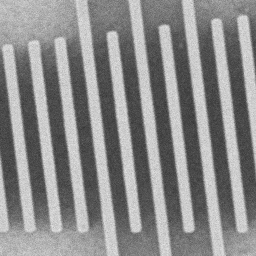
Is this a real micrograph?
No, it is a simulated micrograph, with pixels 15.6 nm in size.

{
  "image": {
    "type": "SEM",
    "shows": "groups of lines, slits or small figures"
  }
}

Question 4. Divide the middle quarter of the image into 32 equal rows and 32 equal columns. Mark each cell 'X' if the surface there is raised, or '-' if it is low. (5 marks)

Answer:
X----XXX----XX----XXX----XX-----
X----XXX----XX-----XX----XXX----
X----XXX----XXX----XX----XXX----
X----XXX----XXX----XX----XXX----
XX----XX----XXX----XX----XXX----
XX----XX----XXX----XX-----XX----
XX----XX----XXX----XXX----XX----
XX----XX-----XX----XXX----XX----
XX----XXX----XX----XXX----XX----
XX----XXX----XX-----XX----XXX---
XX----XXX----XX-----XX----XXX---
XX----XXX----XXX----XX----XXX---
XXX----XX----XXX----XX-----XX---
XXX----XX----XXX----XX-----XX---
XXX----XX-----XX----XXX----XX---
XXX----XX-----XX----XXX----XX---
-XX----XXX----XX----XXX----XX---
-XX----XXX----XX-----XX----XX---
-XX----XXX----XX-----XX----XXX--
-XX-----XX----XXX----XX----XXX--
-XX-----XX----XXX----XX-----XX--
-XX-----XX----XXX----XXX----XX--
-XXX----XX-----XX----XXX----XX--
-XXX----XXX----XX----XXX----XX--
--XX----XXX----XX----XXX----XX--
--XX----XXX----XX----XXX----XXX-
--XX----XXX----XXX----XX----XXX-
--XX-----XX----XXX----XX----XXX-
--XXX----XX----XXX----XX----XXX-
--XXX----XX----XXX----XX-----XX-
--XXX----XX----XXX----XXX----XX-
--XXX----XX-----XX----XXX----XX-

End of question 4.